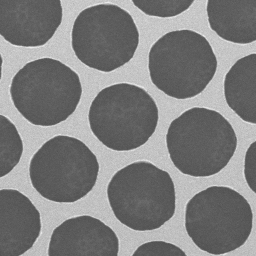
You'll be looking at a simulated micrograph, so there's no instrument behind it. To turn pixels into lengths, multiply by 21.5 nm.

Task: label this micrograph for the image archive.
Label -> a regular array of holes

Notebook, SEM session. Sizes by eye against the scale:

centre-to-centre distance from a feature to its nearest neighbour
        79.7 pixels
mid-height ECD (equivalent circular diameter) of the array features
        1470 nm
